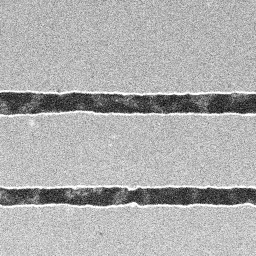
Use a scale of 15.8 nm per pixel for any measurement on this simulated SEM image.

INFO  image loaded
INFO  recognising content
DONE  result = one or a few lines or trenches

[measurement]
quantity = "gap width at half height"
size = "1140 nm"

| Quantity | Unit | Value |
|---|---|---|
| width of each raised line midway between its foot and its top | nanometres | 315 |